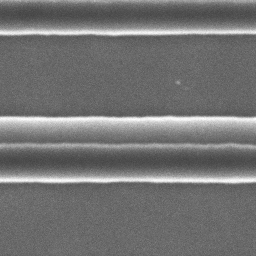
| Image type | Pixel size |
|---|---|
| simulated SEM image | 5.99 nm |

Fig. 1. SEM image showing lines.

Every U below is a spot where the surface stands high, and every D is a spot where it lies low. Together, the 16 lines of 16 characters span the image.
UUUUUUUUUUUUUUUU
UUUUUUUUUUUUUUUU
DDDDDDDDDDDDDDDD
DDDDDDDDDDDDDDDD
DDDDDDDDDDDDDDDD
DDDDDDDDDDDDDDDD
DDDDDDDDDDDDDDDD
UUUUUUUUUUUUUUUU
UUUUUUUUUUUUUUUU
UUUUUUUUUUUUUUUU
UUUUUUUUUUUUUUUU
DDDDDDDDDDDDDDDD
DDDDDDDDDDDDDDDD
DDDDDDDDDDDDDDDD
DDDDDDDDDDDDDDDD
DDDDDDDDDDDDDDDD